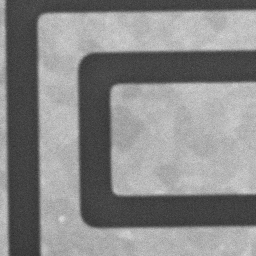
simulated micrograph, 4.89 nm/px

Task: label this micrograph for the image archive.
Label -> groups of lines, slits or small figures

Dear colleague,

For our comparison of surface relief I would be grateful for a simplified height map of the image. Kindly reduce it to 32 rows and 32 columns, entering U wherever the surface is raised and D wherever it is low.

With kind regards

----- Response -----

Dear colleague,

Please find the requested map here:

UDDDDDDDDDDDDDDDDDDDDDDDDDDDDDDD
UDDDDDDDDDDDDDDDDDDDDDDUUUUUUUUU
UDDDDUUUUUUUUUUUUUUUUUUUUUUUUUUU
UDDDDUUUUUUUUUUUUUUUUUUUUUUUUUUU
UDDDDUUUUUUUUUUUUUUUUUUUUUUUUUUU
UDDDDUUUUUUUUUUUUUUUUUUUUUUUUUUU
UDDDDUUUUUUUDDDDDDDDDDDDDDDDDDDD
UDDDDUUUUUDDDDDDDDDDDDDDDDDDDDDD
UDDDDUUUUUDDDDDDDDDDDDDDDDDDDDDD
UDDDDUUUUUDDDDDDDDDDDDDDDDDDDDDD
UDDDDUUUUUDDDDDDDDDDDUUUUUUUUUUU
UDDDDUUUUUDDDDUUUUUUUUUUUUUUUUUU
UDDDDUUUUUDDDDUUUUUUUUUUUUUUUUUU
UDDDDUUUUUDDDDUUUUUUUUUUUUUUUUUU
UDDDDUUUUUDDDDUUUUUUUUUUUUUUUUUU
UDDDDUUUUUDDDDUUUUUUUUUUUUUUUUUU
UDDDDUUUUUDDDDUUUUUUUUUUUUUUUUUU
UDDDDUUUUUDDDDUUUUUUUUUUUUUUUUUU
UDDDDUUUUUDDDDUUUUUUUUUUUUUUUUUU
UDDDDUUUUUDDDDUUUUUUUUUUUUUUUUUU
UDDDDUUUUUDDDDUUUUUUUUUUUUUUUUUU
UDDDDUUUUUDDDDUUUUUUUUUUUUUUUUUU
UDDDDUUUUUDDDDUUUUUUUUUUUUUUUUUU
UDDDDUUUUUDDDDUUUUUUUUUUUUUUUUUU
UDDDDUUUUUDDDDDDDDDDDDDDDDDDDDDD
UDDDDUUUUUDDDDDDDDDDDDDDDDDDDDDD
UDDDDUUUUUDDDDDDDDDDDDDDDDDDDDDD
UDDDDUUUUUDDDDDDDDDDDDDDDDDDDDDD
UDDDDUUUUUUUDDDDDDDDDDDDDUUUUUUU
UDDDDUUUUUUUUUUUUUUUUUUUUUUUUUUU
UDDDDUUUUUUUUUUUUUUUUUUUUUUUUUUU
UDDDDUUUUUUUUUUUUUUUUUUUUUUUUUUU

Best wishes